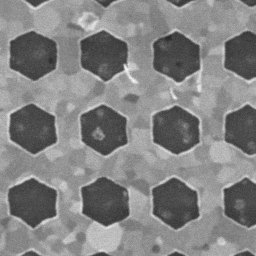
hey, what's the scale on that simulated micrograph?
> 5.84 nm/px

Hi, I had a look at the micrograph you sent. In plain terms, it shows a regular array of holes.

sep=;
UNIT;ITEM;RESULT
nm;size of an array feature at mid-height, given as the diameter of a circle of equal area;287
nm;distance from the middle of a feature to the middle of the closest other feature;416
